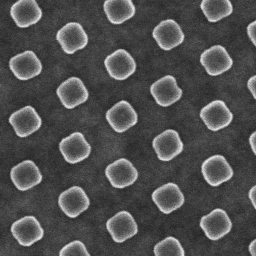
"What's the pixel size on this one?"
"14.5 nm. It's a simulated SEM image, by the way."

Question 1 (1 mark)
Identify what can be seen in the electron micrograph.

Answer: a regular array of raised bodies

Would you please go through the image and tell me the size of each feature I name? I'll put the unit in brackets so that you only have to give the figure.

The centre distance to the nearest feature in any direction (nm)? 781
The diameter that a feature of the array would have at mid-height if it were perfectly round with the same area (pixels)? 28.5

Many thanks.